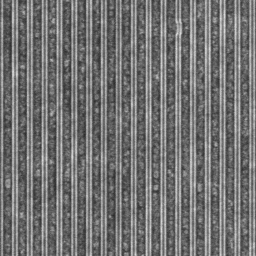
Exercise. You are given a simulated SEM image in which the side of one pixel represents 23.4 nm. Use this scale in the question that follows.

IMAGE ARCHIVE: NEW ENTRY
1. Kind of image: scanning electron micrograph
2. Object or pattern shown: parallel lines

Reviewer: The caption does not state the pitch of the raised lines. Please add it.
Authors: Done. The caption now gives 346 nm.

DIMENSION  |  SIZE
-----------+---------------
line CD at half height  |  4.87 pixels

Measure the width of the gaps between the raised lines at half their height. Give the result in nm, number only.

231